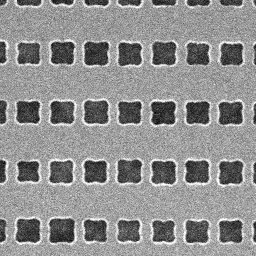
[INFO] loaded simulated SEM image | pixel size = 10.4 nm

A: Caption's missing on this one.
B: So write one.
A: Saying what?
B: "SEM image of a regular array of holes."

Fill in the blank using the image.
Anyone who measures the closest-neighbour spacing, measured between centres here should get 352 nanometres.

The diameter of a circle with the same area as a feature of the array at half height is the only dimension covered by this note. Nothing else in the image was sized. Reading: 270 nanometers